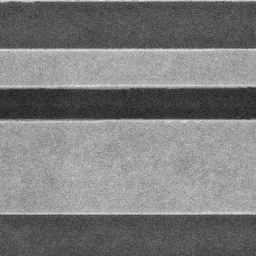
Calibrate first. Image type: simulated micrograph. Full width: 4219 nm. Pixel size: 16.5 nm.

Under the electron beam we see lines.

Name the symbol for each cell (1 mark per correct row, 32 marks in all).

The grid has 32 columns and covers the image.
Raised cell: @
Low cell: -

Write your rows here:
--------------------------------
--------------------------------
--------------------------------
--------------------------------
--------------------------------
--------------------------------
@@@@@@@@@@@@@@@@@@@@@@@@@@@@@@@@
@@@@@@@@@@@@@@@@@@@@@@@@@@@@@@@@
@@@@@@@@@@@@@@@@@@@@@@@@@@@@@@@@
@@@@@@@@@@@@@@@@@@@@@@@@@@@@@@@@
@@@@@@@@@@@@@@@@@@@@@@@@@@@@@@@@
--------------------------------
--------------------------------
--------------------------------
--------------------------------
@@@@@@@@@@@@@@@@@@@@@@@@@@@@@@@@
@@@@@@@@@@@@@@@@@@@@@@@@@@@@@@@@
@@@@@@@@@@@@@@@@@@@@@@@@@@@@@@@@
@@@@@@@@@@@@@@@@@@@@@@@@@@@@@@@@
@@@@@@@@@@@@@@@@@@@@@@@@@@@@@@@@
@@@@@@@@@@@@@@@@@@@@@@@@@@@@@@@@
@@@@@@@@@@@@@@@@@@@@@@@@@@@@@@@@
@@@@@@@@@@@@@@@@@@@@@@@@@@@@@@@@
@@@@@@@@@@@@@@@@@@@@@@@@@@@@@@@@
@@@@@@@@@@@@@@@@@@@@@@@@@@@@@@@@
@@@@@@@@@@@@@@@@@@@@@@@@@@@@@@@@
@@@@@@@@@@@@@@@@@@@@@@@@@@@@@@@@
--------------------------------
--------------------------------
--------------------------------
--------------------------------
--------------------------------